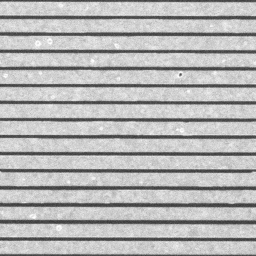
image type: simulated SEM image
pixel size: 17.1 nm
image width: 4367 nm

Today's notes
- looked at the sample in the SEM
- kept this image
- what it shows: parallel lines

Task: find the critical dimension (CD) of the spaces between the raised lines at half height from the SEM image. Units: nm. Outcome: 70.4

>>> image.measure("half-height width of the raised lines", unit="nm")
220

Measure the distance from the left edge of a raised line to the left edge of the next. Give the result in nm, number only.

291